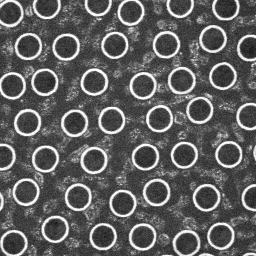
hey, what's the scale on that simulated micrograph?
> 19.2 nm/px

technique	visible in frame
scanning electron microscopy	a regular array of raised bodies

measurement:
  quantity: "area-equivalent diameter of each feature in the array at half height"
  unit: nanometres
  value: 484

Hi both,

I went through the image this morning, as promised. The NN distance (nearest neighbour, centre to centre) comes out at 738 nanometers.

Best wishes